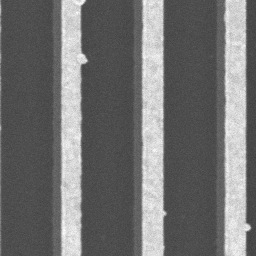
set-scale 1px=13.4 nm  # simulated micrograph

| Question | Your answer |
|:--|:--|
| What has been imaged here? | lines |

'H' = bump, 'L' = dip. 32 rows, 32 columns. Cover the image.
LLLLLLLHHHLLLLLLLHHHLLLLLLLHHHHL
LLLLLLLHHHLLLLLLLHHHLLLLLLLHHHHL
LLLLLLLHHHLLLLLLLHHHLLLLLLLHHHHL
LLLLLLLHHHLLLLLLLHHHLLLLLLLHHHHL
LLLLLLLHHHLLLLLLLHHHLLLLLLLHHHHL
LLLLLLLHHHLLLLLLLHHHLLLLLLLHHHHL
LLLLLLLHHHLLLLLLLHHHLLLLLLLHHHHL
LLLLLLLHHHHLLLLLLHHHLLLLLLLHHHHL
LLLLLLLHHHLLLLLLLHHHLLLLLLLHHHHL
LLLLLLLHHHLLLLLLLHHHLLLLLLLHHHHL
LLLLLLLHHHLLLLLLLHHHLLLLLLLHHHHL
LLLLLLLHHHLLLLLLLHHHLLLLLLLHHHHL
LLLLLLLHHHLLLLLLLHHHLLLLLLLHHHHL
LLLLLLLHHHLLLLLLLHHHLLLLLLLHHHHL
LLLLLLLHHHLLLLLLLHHHLLLLLLLHHHHL
LLLLLLLHHHLLLLLLLHHHLLLLLLLHHHHL
LLLLLLLHHHLLLLLLLHHHLLLLLLLHHHHL
LLLLLLLHHHLLLLLLLHHHLLLLLLLHHHHL
LLLLLLLHHHLLLLLLLHHHLLLLLLLHHHHL
LLLLLLLHHHLLLLLLLHHHLLLLLLLHHHHL
LLLLLLLHHHLLLLLLLHHHLLLLLLLHHHHL
LLLLLLLHHHLLLLLLLHHHLLLLLLLHHHHL
LLLLLLLHHHLLLLLLLHHHLLLLLLLHHHHL
LLLLLLLHHHLLLLLLLHHHLLLLLLLHHHHL
LLLLLLLHHHLLLLLLLHHHLLLLLLLHHHHL
LLLLLLLHHHLLLLLLLHHHLLLLLLLHHHHL
LLLLLLLHHHLLLLLLLHHHHLLLLLLHHHHL
LLLLLLLHHHLLLLLLLHHHLLLLLLLHHHHL
LLLLLLLHHHLLLLLLLHHHLLLLLLLHHHHL
LLLLLLLHHHLLLLLLLHHHLLLLLLLHHHHL
LLLLLLLHHHLLLLLLLHHHLLLLLLLHHHHL
LLLLLLLHHHLLLLLLLHHHLLLLLLLHHHHL